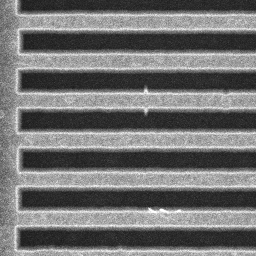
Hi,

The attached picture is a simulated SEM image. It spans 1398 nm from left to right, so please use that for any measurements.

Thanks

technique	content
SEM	parallel lines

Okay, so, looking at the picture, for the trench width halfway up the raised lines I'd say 115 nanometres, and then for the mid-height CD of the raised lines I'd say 0.0997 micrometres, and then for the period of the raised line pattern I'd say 215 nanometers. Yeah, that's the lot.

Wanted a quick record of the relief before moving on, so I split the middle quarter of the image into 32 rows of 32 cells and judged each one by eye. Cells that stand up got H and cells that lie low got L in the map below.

HHHHHHHHHHHHHHHHHHHHHHHHHHHHHHHH
LLLLLLLLLLLLLHLLLLLLLLLLLLLLLLLL
LLLLLLLLLLLLLLLLLLLLLLLLLLLLLLLL
LLLLLLLLLLLLLLLLLLLLLLLLLLLLLLLL
LLLLLLLLLLLLLLLLLLLLLLLLLLLLLLLL
LLLLLLLLLLLLLLLLLLLLLLLLLLLLLLLL
LLLLLLLLLLLLLLLLLLLLHLLLLLLLLLLL
HHHHHHHHHHHHHHHHHHHHHHHHHHHHHHHH
HHHHHHHHHHHHHHHHHHHHHHHHHHHHHHHH
HHHHHHHHHHHHHHHHHHHHHHHHHHHHHHHH
HHHHHHHHHHHHHHHHHHHHHHHHHHHHHHHH
LLLHLLLLLLLHLLLLLLLLHLLLLLLLLLLL
LLLLLLLLLLLLLLLLLLLLLLLLLLLLLLLL
LLLLLLLLLLLLLLLLLLLLLLLLLLLLLLLL
LLLLLLLLLLLLLLLLLLLLLLLLLLLLLLLL
LLLLLLLLLLLLLLLLLLLLLLLLLLLLLLLL
LLLLLLLLLLLLLLLLLLLLLLLLLLLLLLLL
HHHHHHHHHHHHHHHHHHHHHHHHHHHHHHHH
HHHHHHHHHHHHHHHHHHHHHHHHHHHHHHHH
HHHHHHHHHHHHHHHHHHHHHHHHHHHHHHHH
HHHHHHHHHHHHHHHHHHHHHHHHHHHHHHHH
LLLLLLLLLLLLLLLLLLLLLLLLLLLLLLLL
LLLLLLLLLLLLLLLLLLLLLLLLLLLLLLLL
LLLLLLLLLLLLLLLLLLLLLLLLLLLLLLLL
LLLLLLLLLLLLLLLLLLLLLLLLLLLLLLLL
LLLLLLLLLLLLLLLLLLLLLLLLLLLLLLLL
LLLLLLLLLLLLLLLLLLLLLLLLLLLLLLLL
HHHHHHHHHHHHHHHHHHHHHHHHHHHHHHHH
HHHHHHHHHHHHHHHHHHHHHHHHHHHHHHHH
HHHHHHHHHHHHHHHHHHHHHHHHHHHHHHHH
HHHHHHHHHHHHHHHHHHHHHHHHHHHHHHHH
LLLLLLLLLLLLLLLLLLLLLLLLLLLLLLLL